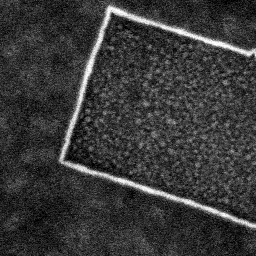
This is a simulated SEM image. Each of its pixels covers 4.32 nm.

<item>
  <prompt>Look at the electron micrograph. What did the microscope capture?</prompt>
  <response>one or a few lines or trenches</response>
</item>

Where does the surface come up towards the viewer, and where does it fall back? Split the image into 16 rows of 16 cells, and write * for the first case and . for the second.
****************
*******...******
******.......***
******..........
******..........
*****...........
*****...........
*****...........
****............
****............
*****...........
********........
***********.....
**************..
****************
****************